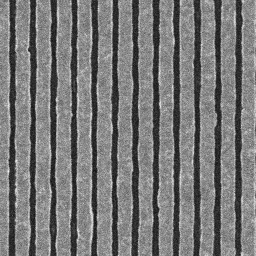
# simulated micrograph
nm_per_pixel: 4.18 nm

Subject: parallel lines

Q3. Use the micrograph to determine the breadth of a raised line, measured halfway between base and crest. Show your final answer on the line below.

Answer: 57.5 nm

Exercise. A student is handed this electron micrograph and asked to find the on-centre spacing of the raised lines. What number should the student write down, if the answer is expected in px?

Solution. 20.5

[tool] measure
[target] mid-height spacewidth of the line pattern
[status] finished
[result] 28.7 nm